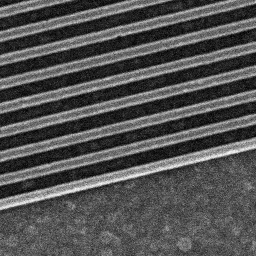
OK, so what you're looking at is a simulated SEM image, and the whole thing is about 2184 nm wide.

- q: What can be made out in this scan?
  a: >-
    parallel lines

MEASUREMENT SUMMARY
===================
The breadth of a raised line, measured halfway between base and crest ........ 75.6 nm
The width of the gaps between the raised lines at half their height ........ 0.122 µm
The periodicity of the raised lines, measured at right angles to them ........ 199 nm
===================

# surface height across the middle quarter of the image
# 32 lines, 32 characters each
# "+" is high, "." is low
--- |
+++++++.................++++++++
++++...............+++++++++....
...............+++++++++........
..........++++++++++............
......++++++++++...............+
...++++++++................+++++
++++++++...............+++++++++
++++...............+++++++++....
...............++++++++++.......
...........+++++++++............
.......++++++++.................
..+++++++++.................++++
++++++++................++++++++
++++...............++++++++++...
...............+++++++++........
...........+++++++++............
.......+++++++++................
...+++++++++................++++
++++++++...............+++++++++
++++...............+++++++++....
...............+++++++++........
...........+++++++++............
.......+++++++++................
...+++++++++...............+++++
++++++++...............+++++++++
++++...............+++++++++....
...............+++++++++........
...........+++++++++............
.......+++++++++................
...+++++++++....................
++++++++........................
+++.............................